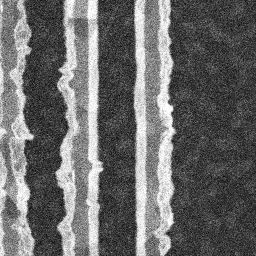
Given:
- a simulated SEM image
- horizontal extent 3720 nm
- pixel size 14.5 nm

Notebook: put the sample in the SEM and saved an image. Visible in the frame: one or a few lines or trenches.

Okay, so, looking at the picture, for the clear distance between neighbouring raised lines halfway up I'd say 666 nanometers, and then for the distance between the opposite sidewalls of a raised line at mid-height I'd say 0.367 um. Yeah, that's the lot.